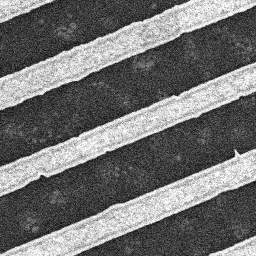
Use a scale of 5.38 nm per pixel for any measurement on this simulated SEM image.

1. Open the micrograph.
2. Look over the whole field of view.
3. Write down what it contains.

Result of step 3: one or a few lines or trenches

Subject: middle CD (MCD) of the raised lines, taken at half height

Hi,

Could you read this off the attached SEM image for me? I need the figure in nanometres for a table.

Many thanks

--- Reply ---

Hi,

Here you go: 141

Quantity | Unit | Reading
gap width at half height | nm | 292